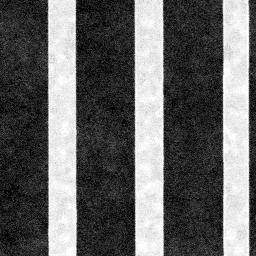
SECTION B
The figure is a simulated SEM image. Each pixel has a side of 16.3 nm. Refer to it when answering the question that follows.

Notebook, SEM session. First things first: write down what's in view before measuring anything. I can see one or a few lines or trenches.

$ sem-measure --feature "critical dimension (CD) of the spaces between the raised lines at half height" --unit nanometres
995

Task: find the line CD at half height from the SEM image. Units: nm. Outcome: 437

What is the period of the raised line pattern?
1.42 microns